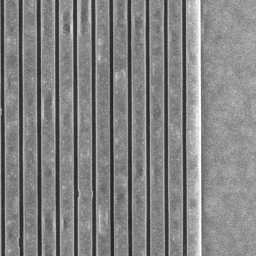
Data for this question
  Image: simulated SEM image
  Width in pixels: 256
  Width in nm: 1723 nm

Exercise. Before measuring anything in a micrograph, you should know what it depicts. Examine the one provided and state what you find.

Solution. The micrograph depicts parallel lines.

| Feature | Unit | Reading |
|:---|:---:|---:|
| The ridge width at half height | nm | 96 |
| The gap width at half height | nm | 26.1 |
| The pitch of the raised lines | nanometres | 122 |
